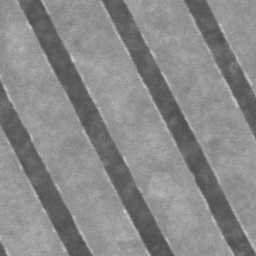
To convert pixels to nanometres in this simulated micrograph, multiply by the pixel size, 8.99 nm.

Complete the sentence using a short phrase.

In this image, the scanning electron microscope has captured one or a few lines or trenches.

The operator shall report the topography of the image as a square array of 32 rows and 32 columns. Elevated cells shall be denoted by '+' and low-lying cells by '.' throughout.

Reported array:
++...++++++++...+++++++...++++++
+++...+++++++...++++++++...+++++
+++...++++++++...+++++++...+++++
++++...+++++++...++++++++...++++
++++...++++++++...+++++++...++++
+++++...+++++++...++++++++...+++
+++++....+++++++...+++++++...+++
+.++++...+++++++...++++++++...++
++++++....+++++++...+++++.+..+++
+++++++...+++++++...++++++++...+
++++++++...++++.++...+++++++...+
.+++++++...++++++++..++++++++...
.++++++++...+++++++...+++++++...
..+++++++...++++++++..++++++++..
..++++++++...+++++++...+++++++..
...+++++.+...++++++++...+++++++.
....+++++++...+++++++...+++++++.
+...+++++++...++++++++...+++++++
++..++++++++...+++++++...+++++++
++...+++++++...++++++++...++++++
++....+++++++...+++++++...++++++
+++...+++++++...++++++++...+++++
++++...+++++++...+++++++...+++++
++++...+++++++...++++++++...++++
+++++...+++++++...+++++++...++++
+++++...+++++++...++++++++...+++
++++++...+++++++...++.++++...+++
++++++...+++++++...++++++++...++
+++++++...+++++++...+++++++...++
+++++++...+++++++....+++++++...+
++++++++...+++++++...+++++++...+
.+++++++...+++++++....+++++++...